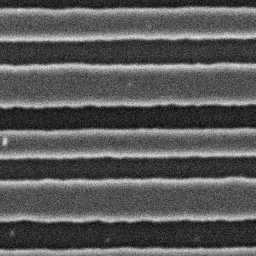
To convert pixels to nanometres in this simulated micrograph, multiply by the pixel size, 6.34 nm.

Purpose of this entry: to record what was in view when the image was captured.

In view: lines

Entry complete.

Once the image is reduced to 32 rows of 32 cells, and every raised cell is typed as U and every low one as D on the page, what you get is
DDDDDDDDDDDDDDDDDDDDDDDDDDDDDDDD
UUUUUUUUUUUUUUUUUUUUUUUUUUUUUUUU
UUUUUUUUUUUUUUUUUUUUUUUUUUUUUUUU
UUUUUUUUUUUUUUUUUUUUUUUUUUUUUUUU
UUUUUUUUUUUUUUUUUUUUUUUUUUUUUUUU
DDDDDDDDDDDDDDDDDDDDDDDDDDDDDDDD
DDDDDDDDDDDDDDDDDDDDDDDDDDDDDDDD
DDDDDDDDDDDDDDDDDDDDDDDDDDDDDDDD
UUUUUUUUUUUUUUUUUUUUUUUUUUUUUUUU
UUUUUUUUUUUUUUUUUUUUUUUUUUUUUUUU
UUUUUUUUUUUUUUUUUUUUUUUUUUUUUUUU
UUUUUUUUUUUUUUUUUUUUUUUUUUUUUUUU
UUUUUUUUUUUUUUUUUUUUUUUUUUUUUUUU
DDDDDDDDDDDDDDDDDDDDDDDDDDDDDDDD
DDDDDDDDDDDDDDDDDDDDDDDDDDDDDDDD
DDDDDDDDDDDDDDDDDDDDDDDDDDDDDDDD
UUUUUDUUUUUUUUUUUUUUUUUUUUUUUUUU
UUUUUUUUUUUUUUUUUUUUUUUUUUUUUUUU
UUUUUUUUUUUUUUUUUUUUUUUUUUUUUUUU
UUUUUUUUUUUUUDUUUUUUUUDDDDDDDDDD
DDDDDDDDDDDDDDDDDDDDDDDDDDDDDDDD
DDDDDDDDDDDDDDDDDDDDDDDDDDDDDDDD
DDDDDDDDDDDDDDDUDDDUDDDUUUUUUUUU
UUUUUUUUUUUUUUUUUUUUUUUUUUUUUUUU
UUUUUUUUUUUUUUUUUUUUUUUUUUUUUUUU
UUUUUUUUUUUUUUUUUUUUUUUUUUUUUUUU
UUUUUUUUUUUUUUUUUUUUUUUUUUUUUUUU
UUDDUUUUUUUUDUUUUUDUUDDDDDDDDDDD
DDDDDDDDDDDDDDDDDDDDDDDDDDDDDDDD
DDDDDDDDDDDDDDDDDDDDDDDDDDDDDDDD
DDDDDDDDDDDDDDDDDDDDDDDDDDDDDDDD
UUUUUUUUUUUUUUUUUUUUUUUUUUUUUUUU